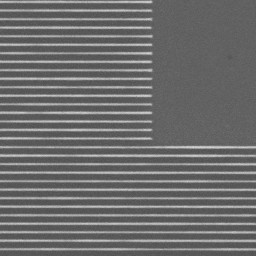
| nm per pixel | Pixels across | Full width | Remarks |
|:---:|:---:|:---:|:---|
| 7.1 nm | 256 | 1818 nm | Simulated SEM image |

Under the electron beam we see parallel lines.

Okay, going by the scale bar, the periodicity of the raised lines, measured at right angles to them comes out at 0.0604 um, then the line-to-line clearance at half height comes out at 49.7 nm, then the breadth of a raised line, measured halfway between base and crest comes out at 14.2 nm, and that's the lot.